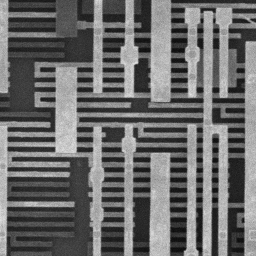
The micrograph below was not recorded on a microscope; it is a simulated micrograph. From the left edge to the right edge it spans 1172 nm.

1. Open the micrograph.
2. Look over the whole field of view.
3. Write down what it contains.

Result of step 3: wiring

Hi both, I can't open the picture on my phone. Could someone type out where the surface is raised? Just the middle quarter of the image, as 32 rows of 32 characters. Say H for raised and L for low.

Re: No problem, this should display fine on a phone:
LLLLLLLHHHLLLLLHHHLLLLHHHHHLLLLH
HHHLLLLHHHLLLLLHHLLLLLHHHHHLLLLH
HHHLLLLHHHLLLLLHHLLLLLHHHHHLLLLH
HHHLLLLHHLLLLLLHHLLLLLHHHHHLLLLH
HHHLLLLHHLLLLLLHHLLLLLHHHHHLLLLH
HHHLLLLHHLLLLLLHHLLLLLHHHHHLLLLH
HHHLLLLHHLLLLLLHHLLLLLHHHHHLLLLH
HHHLLLLLLLLLLLLHHLLLLLHHHHHLLLLH
HHHLLLLLLLLLLLLLLLLLLLHHHHLLLLLL
HHHLLLLLLLLLLLLLLLLLLLLLLLLLLLLL
HHHLLLLLLLLLLLLLLLLLLLLLLLLLLLLL
HHHLLLLLLLLLLLLLLLLLLLLLLLLLLLLL
HHHLLLLLLLLLLLLLLLLLLLLLLLLLLLLL
HHHLLLLLLLLLLLLLLLLLLLLLLLLLLLLL
HHHLLLLLLLLLLLLLLLLLLLLLLLLLLLLL
HHHLLLLLLLLLLLLHHLLLLLLLLLLLLLLH
HHHLLLLHHLLLLLLHHLLLLLLLLLLLLLLH
HHHLLLLHHLLLLLLHHLLLLLLLLLLLLLLH
HHHLLLLHHLLLLLLHHHLLLLLLLLLLLLLH
HHHLLLLHHLLLLLLHHHLLLLLLLLLLLLLH
HHHLLLLHHLLLLLLHHHLLLLLLLLLLLLLH
HHHLLLLHHLLLLLLHHHLLLLLLLLLLLLLH
LLLLLLLHHLLLLLLHHLLLLLHHHHLLLLLH
LLLLLLLHHLLLLLLHHLLLLLHHHHLLLLLH
LLLLLLLHHLLLLLLHHLLLLLHHHHLLLLLH
LLLLLLLHHLLLLLLHHLLLLLHHHHLLLLLH
LLLLLLLHHHLLLLLHHLLLLLHHHHLLLLLH
LLLLLLLHHHLLLLLHHLLLLLHHHHLLLLLH
LLLLLLLHHHLLLLLHHLLLLLHHHHLLLLLH
LLLLLLLHHHLLLLLHHLLLLLHHHHLLLLLH
LLLLLLLHHLLLLLLHHLLLLLHHHHLLLLLH
LLLLLLLHHLLLLLLHHLLLLLHHHHLLLLLH